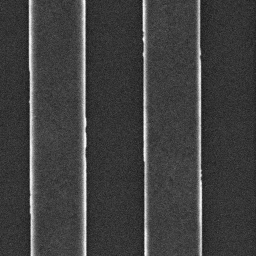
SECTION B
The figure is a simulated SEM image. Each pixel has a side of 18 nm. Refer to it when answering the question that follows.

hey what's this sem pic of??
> lines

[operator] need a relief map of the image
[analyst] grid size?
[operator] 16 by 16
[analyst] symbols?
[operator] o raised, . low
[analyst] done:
..ooo....ooo....
..ooo....ooo....
..ooo....ooo....
..ooo....ooo....
..ooo....oooo...
..ooo....oooo...
..ooo....oooo...
..ooo....oooo...
..ooo....oooo...
..ooo....oooo...
..ooo....oooo...
..ooo....oooo...
..ooo....oooo...
..ooo....oooo...
..ooo....oooo...
..ooo....oooo...